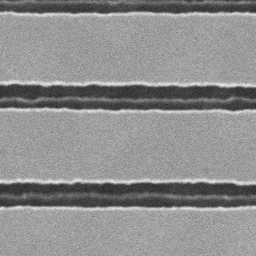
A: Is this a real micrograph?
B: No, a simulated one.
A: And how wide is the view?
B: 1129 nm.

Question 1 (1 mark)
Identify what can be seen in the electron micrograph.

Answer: lines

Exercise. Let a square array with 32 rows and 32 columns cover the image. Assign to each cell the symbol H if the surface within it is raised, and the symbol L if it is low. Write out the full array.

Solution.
LLLLLLLLLLLLLLLLLLLLLLLLLLLLLLLL
HHLLLLLLLLLLLLLLLLLLLLLLLLLLLLLL
HHHHHHHHHHHHHHHHHHHHHHHHHHHHHHHH
HHHHHHHHHHHHHHHHHHHHHHHHHHHHHHHH
HHHHHHHHHHHHHHHHHHHHHHHHHHHHHHHH
HHHHHHHHHHHHHHHHHHHHHHHHHHHHHHHH
HHHHHHHHHHHHHHHHHHHHHHHHHHHHHHHH
HHHHHHHHHHHHHHHHHHHHHHHHHHHHHHHH
HHHHHHHHHHHHHHHHHHHHHHHHHHHHHHHH
HHHHHHHHHHHHHHHHHHHHHHHHHHHHHHHH
HLLLHHHHHHHHHHHHHHHHHHHHHHHHHHHH
LLLLLLLLLLLLLLLLLLLLLLLLLLLLLLLL
LLLLLLLLLLLLLLLLLLLLLLLLLLLLLLLL
LLLLLLLLLLLLLLLLLLLLLLLLLLLLLLLL
HHHHHHHHHHHHHHHHHHHHHHHHHHHHHHHH
HHHHHHHHHHHHHHHHHHHHHHHHHHHHHHHH
HHHHHHHHHHHHHHHHHHHHHHHHHHHHHHHH
HHHHHHHHHHHHHHHHHHHHHHHHHHHHHHHH
HHHHHHHHHHHHHHHHHHHHHHHHHHHHHHHH
HHHHHHHHHHHHHHHHHHHHHHHHHHHHHHHH
HHHHHHHHHHHHHHHHHHHHHHHHHHHHHHHH
HHHHHHHHHHHHHHHHHHHHHHHHHHHHHHHH
HHHHHHHHHHHHHHHHHHHHHHHHHHHHHHHH
LLLLLLLLLLLLLLLLLLLLLLLLLLLLLLLL
LLLLLLLLLLLLLLLLLLLLLLLLLLLLLLLL
LLLLLLLLLLLLLLLLLLLLLLLLLLLLLLLL
HHHHHHHHHHHHHHHHHHHHHHHHHHHHHHHH
HHHHHHHHHHHHHHHHHHHHHHHHHHHHHHHH
HHHHHHHHHHHHHHHHHHHHHHHHHHHHHHHH
HHHHHHHHHHHHHHHHHHHHHHHHHHHHHHHH
HHHHHHHHHHHHHHHHHHHHHHHHHHHHHHHH
HHHHHHHHHHHHHHHHHHHHHHHHHHHHHHHH